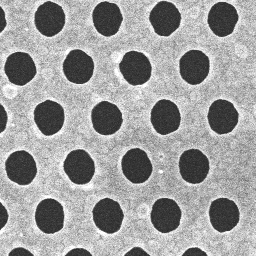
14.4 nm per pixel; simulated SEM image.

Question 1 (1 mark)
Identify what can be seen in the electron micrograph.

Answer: a regular array of holes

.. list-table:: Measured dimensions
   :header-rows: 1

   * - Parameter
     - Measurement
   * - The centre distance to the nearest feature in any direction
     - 816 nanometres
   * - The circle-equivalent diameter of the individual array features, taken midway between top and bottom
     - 0.477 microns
